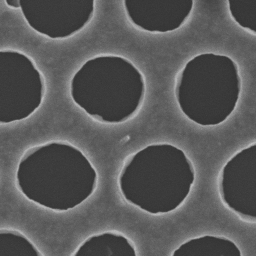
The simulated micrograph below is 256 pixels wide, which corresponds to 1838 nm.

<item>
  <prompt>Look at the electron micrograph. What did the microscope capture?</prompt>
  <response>holes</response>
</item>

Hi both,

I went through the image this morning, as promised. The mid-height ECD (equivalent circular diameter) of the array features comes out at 496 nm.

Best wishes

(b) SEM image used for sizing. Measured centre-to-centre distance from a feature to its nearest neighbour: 723 nm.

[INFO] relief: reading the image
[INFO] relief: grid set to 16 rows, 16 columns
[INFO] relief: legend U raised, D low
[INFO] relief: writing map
UDDDDDUUDDDDUUDD
UUDDDUUUUDDUUUUD
UUUUUUUUUUUUUUUU
DUUUUUUUUUUUDDUU
DDUUUDDDDUUDDDDU
DDDUDDDDDUUDDDDU
DDUUUDDDDUUDDDDU
DUUUUUDDUUUUDDUU
UUUUUUUUUUUUUUUU
UUDDDUUUUDDUUUUD
UDDDDDUUDDDDUUDD
UDDDDDUUDDDDUUDD
UUDDDUUUDDDUUUDD
UUUUUUUUUUUUUUUD
DUUUUUUUUUUUUUUU
DDUUUDDDUUUDDDDU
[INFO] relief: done